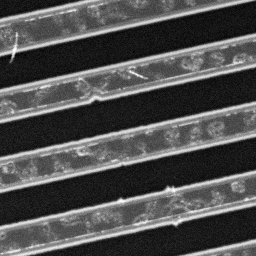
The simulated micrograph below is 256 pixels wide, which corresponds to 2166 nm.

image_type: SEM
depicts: one or a few lines or trenches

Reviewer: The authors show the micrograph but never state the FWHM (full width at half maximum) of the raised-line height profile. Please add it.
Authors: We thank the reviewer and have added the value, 270 nm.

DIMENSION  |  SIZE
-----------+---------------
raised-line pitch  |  568 nm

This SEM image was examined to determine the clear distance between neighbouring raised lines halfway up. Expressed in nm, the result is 302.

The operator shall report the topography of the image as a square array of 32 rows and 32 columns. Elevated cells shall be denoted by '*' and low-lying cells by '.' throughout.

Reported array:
.........********************...
.....*******************........
********************............
***************.................
***********....................*
******....................******
**....................**********
.................***************
.............******************.
.........*****************......
....******************..........
*****************...............
************....................
********.....................***
***.....................********
....................************
...............*****************
...........******************...
......*******************.......
.*******************............
***************.................
***********.....................
*******....................*****
**.....................*********
..................**************
..............******************
.........*******************....
....*******************.........
******************..............
**************..................
*********.....................**
*****.....................******